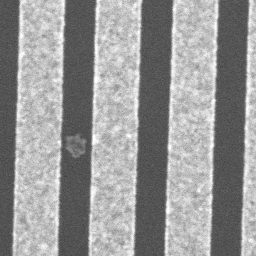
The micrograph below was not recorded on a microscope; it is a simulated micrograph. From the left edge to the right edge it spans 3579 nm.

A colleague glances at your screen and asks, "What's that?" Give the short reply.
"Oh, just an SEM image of lines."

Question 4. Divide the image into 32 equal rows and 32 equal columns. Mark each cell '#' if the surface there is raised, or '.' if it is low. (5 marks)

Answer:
...#####....######....#####....#
...#####....#####.....#####....#
...#####....#####.....#####....#
...#####....#####.....#####....#
...#####....#####.....#####....#
...#####....#####.....#####....#
...#####....#####.....#####....#
...####.....#####.....#####....#
...####.....#####.....#####....#
..######....#####.....#####....#
..######....#####....######....#
..######....#####....######....#
..######....#####....######....#
..######....#####....######....#
..######....#####....######....#
..######....#####....######....#
..######....#####....######....#
..#####.....#####....#####.....#
..#####.....#####....#####.....#
..#####.....#####....#####.....#
..#####.....#####....#####.....#
..#####.....#####....#####.....#
..#####.....#####....#####.....#
..#####.....#####....#####.....#
..#####.....#####....#####....##
..#####....######....#####....##
..#####....######....#####....##
..#####....######....#####....##
..#####....######....#####....##
..#####....######....#####....##
..#####....######....#####....##
..#####....#####.....#####....##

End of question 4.